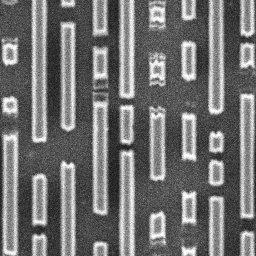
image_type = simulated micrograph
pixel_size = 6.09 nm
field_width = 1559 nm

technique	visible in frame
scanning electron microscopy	parallel lines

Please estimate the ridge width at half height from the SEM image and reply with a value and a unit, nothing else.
12 pixels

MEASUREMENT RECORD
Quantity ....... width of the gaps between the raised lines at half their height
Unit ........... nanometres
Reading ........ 104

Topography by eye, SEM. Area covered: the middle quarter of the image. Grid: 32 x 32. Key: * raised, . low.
**......***...***.....***.....**
**......***...***.....***.....**
**......***...***.....***.....**
**............***.......*......*
**............***...............
**............***...............
**............***...............
**............***...............
**..............................
**..............................
**......***.....................
**......***...***...............
**......***...***...............
**......***...***.....***.....**
**......***...***.....***.....**
**......***...***.....***.....**
........***...***.....***.....**
........***...***.....***.....**
........***...***.....***.....**
........***....**.....***.....**
........***...........***.....**
........***...........***.....**
........***...***.....***.....**
........***...***.....***.......
........***...***.....***.......
**......***...***.....***.......
**......***...***.....***.......
**......***...***.....***.......
**......***...***.....***.......
**......***...***...............
**......***...***...............
**......***...***...............